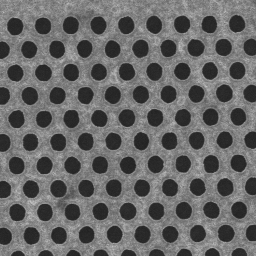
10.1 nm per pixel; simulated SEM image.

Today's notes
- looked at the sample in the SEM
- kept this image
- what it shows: a regular array of holes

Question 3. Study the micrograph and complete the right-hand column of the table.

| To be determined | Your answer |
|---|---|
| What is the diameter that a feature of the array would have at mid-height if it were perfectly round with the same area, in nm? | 169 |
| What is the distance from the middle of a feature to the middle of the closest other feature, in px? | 26.8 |